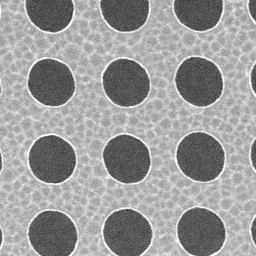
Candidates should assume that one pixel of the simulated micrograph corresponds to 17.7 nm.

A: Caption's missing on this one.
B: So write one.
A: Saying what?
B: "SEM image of holes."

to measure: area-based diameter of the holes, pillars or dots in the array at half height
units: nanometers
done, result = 861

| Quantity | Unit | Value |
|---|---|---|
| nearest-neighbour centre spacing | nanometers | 1300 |